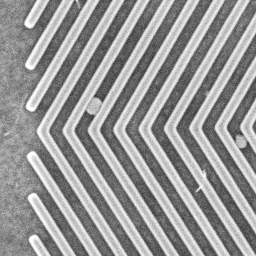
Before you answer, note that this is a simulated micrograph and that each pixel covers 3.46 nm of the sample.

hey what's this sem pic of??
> groups of lines, slits or small figures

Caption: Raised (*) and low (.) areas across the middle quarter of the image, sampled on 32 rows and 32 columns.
...**....***...***....**....**..
..***...***....**....**....***..
..**....**....***...***....**...
.**....***....**....**....***...
***....**....**....***....**....
**....***...***....**....**....*
**...***....**....***...***....*
*....***...***...***....**....**
*...***....**....**....***...***
....*****.***...***....**....**.
...*********....**....**....***.
...**.*****....***....**....**..
..***...***....**....**....***..
.***....**....***...***....**...
.**....***...***....**....***...
***....**....**....***...***....
**....***....**....***...***....
***...***....**....***....**....
.**....***....**....***....**...
.***....**....***....**....**...
..***...***....**....***....**..
...**....***...***....**....***.
...***....**....***...***....**.
....**....***....**....***....**
*....**....**....***....**....**
*....***....**....***...***....*
**....**....***....**....***....
***...***....**....***....**....
.**....***....**....**....***...
.***....**....***....**....**...
..**....***....**....***....**..
...**....***...***....**....***.